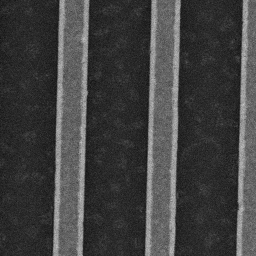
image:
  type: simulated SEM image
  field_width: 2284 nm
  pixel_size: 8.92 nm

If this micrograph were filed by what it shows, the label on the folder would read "one or a few lines or trenches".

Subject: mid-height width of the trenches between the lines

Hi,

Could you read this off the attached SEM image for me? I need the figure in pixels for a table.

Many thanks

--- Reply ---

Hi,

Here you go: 65.6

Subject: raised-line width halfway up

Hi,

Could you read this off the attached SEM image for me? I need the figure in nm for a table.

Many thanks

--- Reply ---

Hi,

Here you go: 230